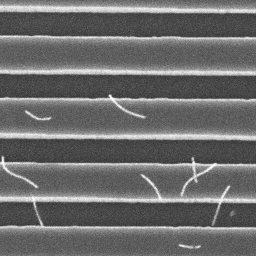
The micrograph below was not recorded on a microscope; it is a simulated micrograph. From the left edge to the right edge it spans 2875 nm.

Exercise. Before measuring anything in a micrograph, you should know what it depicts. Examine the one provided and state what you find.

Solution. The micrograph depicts lines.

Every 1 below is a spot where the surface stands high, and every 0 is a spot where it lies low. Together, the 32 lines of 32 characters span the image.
11111111111111111111111111111111
00000000000000000000000000000000
00000000000000000000000000000000
00000000000000000000000000000000
00000000000000000000000000000000
11111111111111111111111111111111
11111111111111111111111111111111
11111111111111111111111111111111
11111111111111111111111111111111
00000000000000000000000000000000
00000000000000000000000000000000
00000000000000000000000000000000
11111111111111111111111011111111
11111111111111111111111111111111
11111111111111111111111111111111
11111111111111111111111111111111
11111111111111111111111111111111
00000000000000000000000000000000
00000000000000000000000000000000
00000000000000000000000000000000
11111111111111111111000010100000
11111111111111111111111111111111
11111111111111111111111111111111
11111111111111111111111111111111
11111111111111111111111111111111
00000000000000000000000000000000
00000000000000000000000000000000
00000000000000000000000000000000
11111111111111111111111111111111
11111111111111111111111111111111
11111111111111111111111111111111
11111111111111111111111111111111